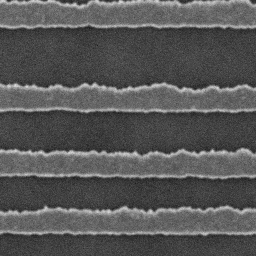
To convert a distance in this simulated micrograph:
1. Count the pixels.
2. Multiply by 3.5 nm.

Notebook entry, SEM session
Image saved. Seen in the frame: lines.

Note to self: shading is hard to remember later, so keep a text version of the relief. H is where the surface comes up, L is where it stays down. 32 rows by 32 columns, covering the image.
HHHHHHHHLLLHHHHHHHHHHHHHHHHHHHHH
HHHHHHHHHHHHHHHHHHHHHHHHHHHHHHHH
HHHHHHHHHHHHHHHHHHHHHHHHHHHHHHHH
LLLLLLLLLLLLLLLLLLLLLLLLLLLLLLLL
LLLLLLLLLLLLLLLLLLLLLLLLLLLLLLLL
LLLLLLLLLLLLLLLLLLLLLLLLLLLLLLLL
LLLLLLLLLLLLLLLLLLLLLLLLLLLLLLLL
LLLLLLLLLLLLLLLLLLLLLLLLLLLLLLLL
LLLLLLLLLLLLLLLLLLLLLLLLLLLLLLLL
LLLLLLLLLLLLLLLLLLLLLLLLLLLLLLLL
LLLLLLLLLLLLLLLLLLLLLLLLLLLLLLLL
HHHHHHHHHHHHHHHHHHHHHHHHHHHHHHHH
HHHHHHHHHHHHHHHHHHHHHHHHHHHHHHHH
HHHHHHHHHHHHHHHHHHHHHHHHHHHHHHHH
LLLLLLLLLLLLLLLLLLLLLLLLLLLLLLLL
LLLLLLLLLLLLLLLLLLLLLLLLLLLLLLLL
LLLLLLLLLLLLLLLLLLLLLLLLLLLLLLLL
LLLLLLLLLLLLLLLLLLLLLLLLLLLLLLLL
LLLLLLLLLLLLLLLLLLLLLLLLLLLLLLLL
HHHHHHHHHHHHHHHHHHHHHHHHHHHHHHHH
HHHHHHHHHHHHHHHHHHHHHHHHHHHHHHHH
HHHHHHHHHHHHHHHHHHHHHHHHHHHHHHHH
LLLLLLLLLLLLLLLLLLLLLLLLLLLLLLLL
LLLLLLLLLLLLLLLLLLLLLLLLLLLLLLLL
LLLLLLLLLLLLLLLLLLLLLLLLLLLLLLLL
LLLLLLLLLLLLLLLLLLLLLLLLLLLLLLLL
LHLHHHHHHHHHHHHHHHHHHHHHHHHHHHHH
HHHHHHHHHHHHHHHHHHHHHHHHHHHHHHHH
HHHHHHHHHHHHHHHHHHHHHHHHHHHHHHHH
LLLLLLLLLLLLLLLLLLLLLLLLLLLLLLLL
LLLLLLLLLLLLLLLLLLLLLLLLLLLLLLLL
LLLLLLLLLLLLLLLLLLLLLLLLLLLLLLLL